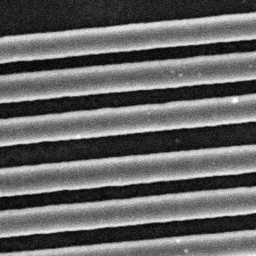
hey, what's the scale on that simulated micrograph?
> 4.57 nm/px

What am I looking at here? lines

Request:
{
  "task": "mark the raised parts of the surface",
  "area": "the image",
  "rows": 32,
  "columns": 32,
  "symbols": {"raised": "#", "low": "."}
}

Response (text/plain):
................................
................................
.........................#######
.............###################
....############################
#########################.......
#############...................
####...................#########
...........#####################
.###############################
#########################.......
##############..................
####......................######
................################
......##########################
############################....
##################..............
#######.........................
.............................###
..................##############
........########################
###############################.
####################............
###########.....................
....................############
...........#####################
################################
#######################.........
############....................
##........................######
...............#################
....############################